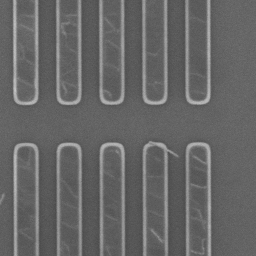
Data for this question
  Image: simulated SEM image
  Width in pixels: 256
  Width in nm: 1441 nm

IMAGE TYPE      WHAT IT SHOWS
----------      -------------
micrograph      groups of lines, slits or small figures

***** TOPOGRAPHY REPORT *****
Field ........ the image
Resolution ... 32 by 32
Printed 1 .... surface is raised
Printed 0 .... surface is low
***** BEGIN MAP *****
00111001110001100011100111000000
00111001110001100011100111000000
00111001110001100011100111000000
00111001110001100011100111000000
00111001110001100011100111000000
00111001110001100011100111000000
00111001110001100011100111000000
00111001110001100011100111000000
00111001110001100011100111000000
00111001110001100011100111000000
00111001110001100011100111000000
00111001110001100011100111000000
00110000110001100011000011000000
00000000000000000000000000000000
00000000000000000000000000000000
00000000000000000000000000000000
00000000000000000000000000000000
00000000000000000000000000000000
00110000110001100011100011000000
00111001110001100011100111000000
00111001110001100011100111000000
00111001110001100011100111000000
00111001110001100011100111000000
00111001110001100011100111000000
00111001110001100011100111000000
00111001110001100011100111000000
00111001110001100011100111000000
00111001110001100011100111000000
00111001110001100011100111000000
00111001110001100011100111000000
00111001110001100011100111000000
00111001110001100011100111000000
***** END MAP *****